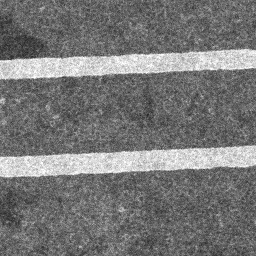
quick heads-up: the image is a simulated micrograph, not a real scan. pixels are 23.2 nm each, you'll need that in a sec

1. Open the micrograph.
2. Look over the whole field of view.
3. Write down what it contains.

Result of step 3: one or a few lines or trenches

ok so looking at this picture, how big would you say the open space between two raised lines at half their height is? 1830 nm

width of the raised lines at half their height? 424 nanometers